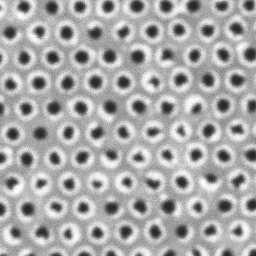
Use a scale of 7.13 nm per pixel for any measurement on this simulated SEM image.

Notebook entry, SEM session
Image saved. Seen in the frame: a regular array of holes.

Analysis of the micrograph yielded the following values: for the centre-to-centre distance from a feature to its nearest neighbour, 198 nm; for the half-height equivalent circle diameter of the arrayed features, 93.5 nm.